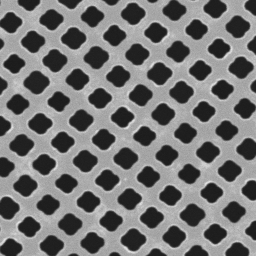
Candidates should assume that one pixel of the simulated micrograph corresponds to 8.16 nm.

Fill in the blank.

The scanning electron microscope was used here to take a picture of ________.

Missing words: a regular array of holes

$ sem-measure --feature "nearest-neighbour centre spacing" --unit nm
234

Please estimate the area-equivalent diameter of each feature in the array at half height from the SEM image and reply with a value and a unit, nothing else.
20.5 px